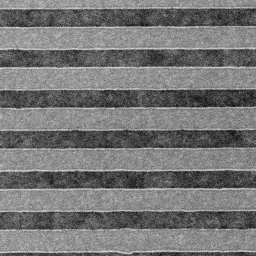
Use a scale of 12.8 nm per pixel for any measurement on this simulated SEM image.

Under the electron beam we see parallel lines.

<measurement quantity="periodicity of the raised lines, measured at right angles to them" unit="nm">517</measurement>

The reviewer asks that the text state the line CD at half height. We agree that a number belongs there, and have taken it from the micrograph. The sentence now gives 276 nanometres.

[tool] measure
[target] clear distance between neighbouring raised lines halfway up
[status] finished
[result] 18.5 px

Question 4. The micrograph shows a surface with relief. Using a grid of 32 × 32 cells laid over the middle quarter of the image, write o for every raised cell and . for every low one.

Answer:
................................
oooooooooooooooooooooooooooooooo
oooooooooooooooooooooooooooooooo
oooooooooooooooooooooooooooooooo
oooooooooooooooooooooooooooooooo
oooooooooooooooooooooooooooooooo
................................
................................
................................
................................
................................
oooooooooooooooooooooooooooooooo
oooooooooooooooooooooooooooooooo
oooooooooooooooooooooooooooooooo
oooooooooooooooooooooooooooooooo
oooooooooooooooooooooooooooooooo
.........oo.....oo.......o......
................................
................................
................................
................................
oooooooooooooooooooooooooooooooo
oooooooooooooooooooooooooooooooo
oooooooooooooooooooooooooooooooo
oooooooooooooooooooooooooooooooo
oooooooooooooooooooooooooooooooo
oo..ooooooooo..ooooooooooo......
................................
................................
................................
................................
oooooooooooooooooooooooooooooo.o